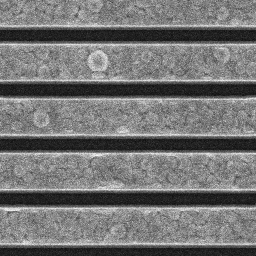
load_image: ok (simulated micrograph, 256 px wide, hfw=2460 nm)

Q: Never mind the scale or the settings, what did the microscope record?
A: parallel lines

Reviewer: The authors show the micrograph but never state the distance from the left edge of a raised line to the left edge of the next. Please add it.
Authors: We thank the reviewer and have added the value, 54.5 px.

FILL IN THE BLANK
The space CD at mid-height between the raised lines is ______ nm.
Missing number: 150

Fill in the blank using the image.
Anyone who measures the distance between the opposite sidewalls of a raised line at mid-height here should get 376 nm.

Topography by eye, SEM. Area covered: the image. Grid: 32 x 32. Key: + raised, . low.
++++++++++++++++++++++++++++++++
++++++++++++++++++++++++++++++++
++++++++++++++++++++++++++++++++
................................
................................
++++++++++++++++++++++++++++++++
++++++++++++++++++++++++++++++++
++++++++++++++++++++++++++++++++
++++++++++++++++++++++++++++++++
++++++++++++++++++++++++++++++++
................................
................................
++++++++++++++++++++++++++++++++
++++++++++++++++++++++++++++++++
++++++++++++++++++++++++++++++++
++++++++++++++++++++++++++++++++
++++++++++++++++++++++++++++++++
................................
................................
++++++++++++++++++++++++++++++++
++++++++++++++++++++++++++++++++
++++++++++++++++++++++++++++++++
++++++++++++++++++++++++++++++++
++++++++++++++++++++++++++++++++
................................
................................
++++++++++++++++++++++++++++++++
++++++++++++++++++++++++++++++++
++++++++++++++++++++++++++++++++
++++++++++++++++++++++++++++++++
++++++++++++++++++++++++++++++++
................................